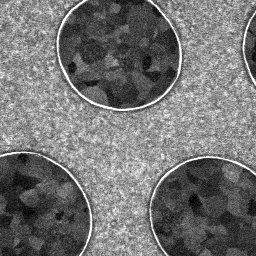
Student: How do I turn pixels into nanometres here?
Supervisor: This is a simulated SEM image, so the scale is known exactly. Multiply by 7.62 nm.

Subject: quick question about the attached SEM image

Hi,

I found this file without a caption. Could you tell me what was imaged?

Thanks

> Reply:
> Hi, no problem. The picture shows raised bodies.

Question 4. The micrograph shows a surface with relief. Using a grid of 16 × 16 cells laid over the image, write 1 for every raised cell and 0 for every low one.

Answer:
0000011111000000
0000111111100000
0000111111100001
0000111111100001
0000111111100000
0000011111100000
0000001110000000
0000000000000000
0000000000000000
0000000000000000
1111000000011110
1111100000111111
1111100001111111
1111110001111111
1111110000111111
1111100000111111